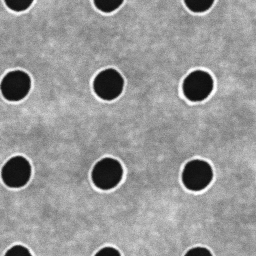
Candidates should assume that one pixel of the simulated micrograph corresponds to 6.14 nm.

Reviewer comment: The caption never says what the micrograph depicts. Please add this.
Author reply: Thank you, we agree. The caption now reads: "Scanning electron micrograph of holes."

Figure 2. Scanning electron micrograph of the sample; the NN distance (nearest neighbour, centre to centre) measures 89.4 pixels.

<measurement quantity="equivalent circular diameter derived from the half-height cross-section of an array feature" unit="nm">193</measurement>